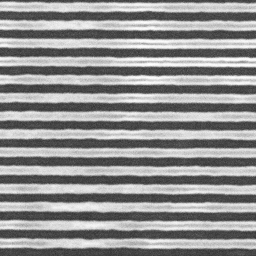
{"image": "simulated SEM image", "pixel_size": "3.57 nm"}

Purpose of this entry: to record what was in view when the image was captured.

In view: parallel lines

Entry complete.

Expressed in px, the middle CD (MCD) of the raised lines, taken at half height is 8.38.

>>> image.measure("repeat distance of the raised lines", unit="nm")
65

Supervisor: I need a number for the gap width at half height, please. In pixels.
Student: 10